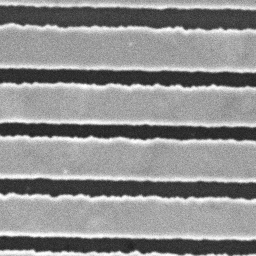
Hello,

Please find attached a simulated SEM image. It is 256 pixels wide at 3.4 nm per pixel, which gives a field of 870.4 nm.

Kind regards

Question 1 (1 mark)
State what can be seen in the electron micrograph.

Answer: lines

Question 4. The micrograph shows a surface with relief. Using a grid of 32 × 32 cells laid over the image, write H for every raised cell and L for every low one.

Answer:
HHHHHHHHHHHHHHHHHHHHHHHHHHHHHHHH
LLLLLLLLLLLLLLLLLLLLLLLLLLLLLLLL
LLLLLLLLLLLLLLLLLLLLLLLLLLLLLLLL
HHHHHHHHHHHHHHHHHHHLLLHLLLLLLLLL
HHHHHHHHHHHHHHHHHHHHHHHHHHHHHHHH
HHHHHHHHHHHHHHHHHHHHHHHHHHHHHHHH
HHHHHHHHHHHHHHHHHHHHHHHHHHHHHHHH
HHHHHHHHHHHHHHHHHHHHHHHHHHHHHHHH
LLLLHHHHHHHHHHHHHHHHHHHHHHHHHHHH
LLLLLLLLLLLLLLLLLLLLLLLLLLLLLLLL
LLLHHLLHLLLLLLLLLLLLLLLLLLLLLLLL
HHHHHHHHHHHHHHHHHHHHHHHHHHHHHHHH
HHHHHHHHHHHHHHHHHHHHHHHHHHHHHHHH
HHHHHHHHHHHHHHHHHHHHHHHHHHHHHHHH
HHHHHHHHHHHHHHHHHHHHHHHHHHHHHHHH
LLLLLLLLLLLLLLLLHHLHHHHHHHHHHHHH
LLLLLLLLLLLLLLLLLLLLLLLLLLLLLLLL
HHHHHHHHHHHHHHHHHLLHHHLLLLLLLLLL
HHHHHHHHHHHHHHHHHHHHHHHHHHHHHHHH
HHHHHHHHHHHHHHHHHHHHHHHHHHHHHHHH
HHHHHHHHHHHHHHHHHHHHHHHHHHHHHHHH
HHHHHHHHHHHHHHHHHHHHHHHHHHHHHHHH
LLLLLLLLLLLLLLHHHHHHHHHHHHHHHHHH
LLLLLLLLLLLLLLLLLLLLLLLLLLLLLLLL
HHHHHHLLHHHLLLLLLLLLLLLLLLLLLLLL
HHHHHHHHHHHHHHHHHHHHHHHHHHHHHHHH
HHHHHHHHHHHHHHHHHHHHHHHHHHHHHHHH
HHHHHHHHHHHHHHHHHHHHHHHHHHHHHHHH
HHHHHHHHHHHHHHHHHHHHHHHHHHHHHHHH
LLLHHHHHHHHHHHHHHHHHHHHHHHHHHHHH
LLLLLLLLLLLLLLLLLLLLLLLLLLLLLLLL
HHHHHHLLHLLLLLLLLLLLLLLLLLLLLLLL